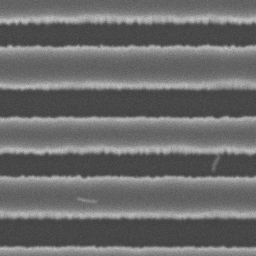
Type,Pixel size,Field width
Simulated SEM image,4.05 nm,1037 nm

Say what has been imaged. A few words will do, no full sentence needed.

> lines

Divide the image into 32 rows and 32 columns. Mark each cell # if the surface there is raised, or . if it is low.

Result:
################################
################################
################################
................................
................................
................................
################################
################################
################################
################################
################################
................................
................................
................................
................................
################################
################################
################################
################################
................................
................................
................................
################################
################################
################################
################################
################################
................................
................................
................................
................................
################################